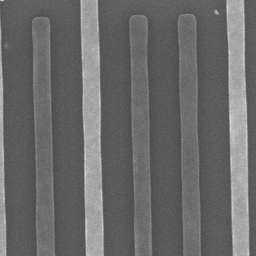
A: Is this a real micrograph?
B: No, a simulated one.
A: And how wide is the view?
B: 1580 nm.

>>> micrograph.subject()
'groups of lines, slits or small figures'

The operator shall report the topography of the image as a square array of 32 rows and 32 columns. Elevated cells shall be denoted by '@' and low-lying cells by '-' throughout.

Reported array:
----------@@----------------@@--
----------@@----------------@@@-
----@@----@@----@@----@@----@@@-
----@@----@@----@@----@@-----@@-
----@@----@@----@@----@@-----@@-
----@@----@@----@@----@@-----@@-
----@@----@@----@@----@@-----@@-
----@@----@@----@@----@@-----@@-
----@@----@@----@@----@@@----@@-
----@@----@@----@@----@@@----@@-
----@@----@@-----@----@@@----@@-
----@@----@@@----@@---@@@----@@-
----@@----@@@----@@----@@----@@-
----@@----@@@----@@----@@----@@-
----@@----@@@----@@----@@----@@-
----@@----@@@----@@----@@----@@-
----@@----@@@----@@----@@----@@-
----@@-----@@----@@----@@----@@-
----@@-----@@----@@----@@----@@-
-----@-----@@----@@----@@----@@-
-----@-----@@----@@----@@----@@-
-----@@----@@----@@----@@----@@-
-----@@----@@----@@----@@----@@-
@----@@----@@----@@----@@----@@-
@----@@----@@----@@----@@----@@-
@----@@----@@----@@----@@----@@-
@----@@----@@----@@----@@----@@-
@----@@----@@----@@----@@----@@-
@----@@----@@----@@----@@----@@-
@----@@----@@----@@----@@----@@-
@----@@----@@----@@----@@----@@-
@----@@----@@----@@----@@----@@-